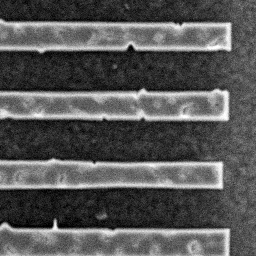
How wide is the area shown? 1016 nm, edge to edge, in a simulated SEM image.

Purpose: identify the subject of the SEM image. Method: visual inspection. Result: one or a few lines or trenches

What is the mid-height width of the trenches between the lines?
169 nm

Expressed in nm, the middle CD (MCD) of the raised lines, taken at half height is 103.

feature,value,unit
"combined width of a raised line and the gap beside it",275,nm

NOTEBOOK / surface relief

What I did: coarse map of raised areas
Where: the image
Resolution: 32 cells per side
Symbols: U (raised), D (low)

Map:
DDDDDDDDDDDDDDDDDDDDDDDDDDDDDDDD
DDDDDDDDDDDDDDDDDDDDDDDDDDDDDDDD
DDDDDDDDDDDDDDDDDDDDDDDDDDDDDDDD
UUUUUUUUUUUUUUUUUUUUUUUUUUUUUDDD
UUUUUUUUUUUUUUUUUUUUUUUUUUUUUDDD
UUUUUUUUUUUUUUUUUUUUUUUUUUUUUDDD
DDDDDDDDDDDDDDDDDDDDDDDDDDDDDDDD
DDDDDDDDDDDDDDDDDDDDDDDDDDDDDDDD
DDDDDDDDDDDDDDDDDDDDDDDDDDDDDDDD
DDDDDDDDDDDDDDDDDDDDDDDDDDDDDDDD
DDDDDDDDDDDDDDDDDDDDDDDDDDDDDDDD
DDDDDDDDDDDDDDDDDUDDDDDDDDUUDDDD
UUUUUUUUUUUUUUUUUUUUUUUUUUUUDDDD
UUUUUUUUUUUUUUUUUUUUUUUUUUUUDDDD
UUUUUUUUUUUUUUUUUUUUUUUUUUUUDDDD
DDDDDDDDDDDDDDDDDDDDDDDDDDDDDDDD
DDDDDDDDDDDDDDDDDDDDDDDDDDDDDDDD
DDDDDDDDDDDDDDDDDDDDDDDDDDDDDDDD
DDDDDDDDDDDDDDDDDDDDDDDDDDDDDDDD
DDDDDDDDDDDDDDDDDDDDDDDDDDDDDDDD
UUUUUUUUUUUUUUUUUUUUUUUUUUUDDDDD
UUUUUUUUUUUUUUUUUUUUUUUUUUUUDDDD
UUUUUUUUUUUUUUUUUUUUUUUUUUUUDDDD
UUUUUUDDDDDDDDDDDDDDDDDDDDDDDDDD
DDDDDDDDDDDDDDDDDDDDDDDDDDDDDDDD
DDDDDDDDDDDDDDDDDDDDDDDDDDDDDDDD
DDDDDDDDDDDDDDDDDDDDDDDDDDDDDDDD
DDDDDDDDDDDDDDDDDDDDDDDDDDDDDDDD
UUDDDDDDDDDDDDDDDDDDDDDDDDDDDDDD
UUUUUUUUUUUUUUUUUUUUUUUUUUUUDDDD
UUUUUUUUUUUUUUUUUUUUUUUUUUUUDDDD
UUUUUUUUUUUUUUUUUUUUUUUUUUUUDDDD